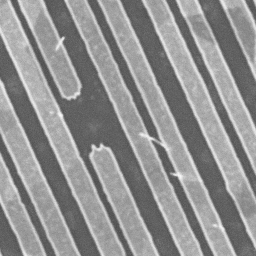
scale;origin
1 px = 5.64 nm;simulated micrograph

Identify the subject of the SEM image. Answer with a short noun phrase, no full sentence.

parallel lines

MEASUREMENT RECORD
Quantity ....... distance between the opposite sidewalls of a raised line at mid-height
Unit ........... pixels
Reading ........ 19.1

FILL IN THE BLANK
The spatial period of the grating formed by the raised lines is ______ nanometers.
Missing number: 200